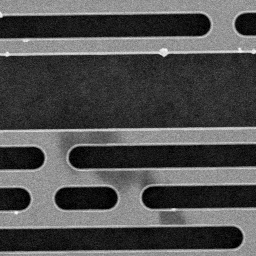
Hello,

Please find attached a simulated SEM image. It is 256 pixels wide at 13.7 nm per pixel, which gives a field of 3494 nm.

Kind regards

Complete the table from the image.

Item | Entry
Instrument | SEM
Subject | groups of lines, slits or small figures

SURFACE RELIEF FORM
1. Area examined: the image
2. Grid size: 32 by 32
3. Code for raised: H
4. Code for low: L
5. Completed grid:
HHHHHHHHHHHHHHHHHHHHHHHHHHHHHHHH
HHHHHHHHHHHHHHHHHHHHHHHHHHHHHHHH
LLLLLLLLLLLLLLLLLLLLLLLLLLHHHLLL
LLLLLLLLLLLLLLLLLLLLLLLLLLHHHLLL
LLLLLLLLLLLLLLLLLLLLLLLLLHHHHHHL
HHHHHHHHHHHHHHHHHHHHHHHHHHHHHHHH
HHHHHHHHHHHHHHHHHHHHHHHHHHHHHHHH
LLLLLLLLLLLLLLLLLLLLLLLLLLLLLLLL
LLLLLLLLLLLLLLLLLLLLLLLLLLLLLLLL
LLLLLLLLLLLLLLLLLLLLLLLLLLLLLLLL
LLLLLLLLLLLLLLLLLLLLLLLLLLLLLLLL
LLLLLLLLLLLLLLLLLLLLLLLLLLLLLLLL
LLLLLLLLLLLLLLLLLLLLLLLLLLLLLLLL
LLLLLLLLLLLLLLLLLLLLLLLLLLLLLLLL
LLLLLLLLLLLLLLLLLLLLLLLLLLLLLLLL
LLLLLLLLLLLLLLLLLLLLLLLLLLLLLLLL
HHHHHHHHHHHHHHHHHHHHHHHHHHHHHHHH
HHHHHHHHHHHHHHHHHHHHHHHHHHHHHHHH
LLLLLHHHHLLLLLLLLLLLLLLLLLLLLLLL
LLLLLLHHHLLLLLLLLLLLLLLLLLLLLLLL
LLLLLHHHHLLLLLLLLLLLLLLLLLLLLLLL
HHHHHHHHHHHHHHHHHHHHHHHHHHHHHHHH
HHHHHHHHHHHHHHHHHHHHHHHHHHHHHHHH
LLLHHHHHLLLLLLHHHHLLLLLLLLLLLLLL
LLLLHHHLLLLLLLLHHHLLLLLLLLLLLLLL
LLLLHHHLLLLLLLLHHHLLLLLLLLLLLLLL
HHHHHHHHHHHHHHHHHHHHHHHHHHHHHHHH
HHHHHHHHHHHHHHHHHHHHHHHHHHHHHHHH
HHLLLLLLLLLLLLLLLLLLLLLLLLLLLLHH
LLLLLLLLLLLLLLLLLLLLLLLLLLLLLLHH
LLLLLLLLLLLLLLLLLLLLLLLLLLLLLLHH
LLLLLHHHHHHHHHHHHHHHHHHHHHHHHHHH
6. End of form